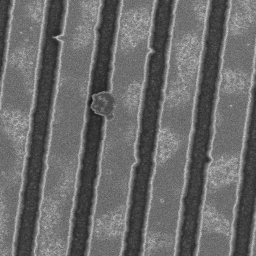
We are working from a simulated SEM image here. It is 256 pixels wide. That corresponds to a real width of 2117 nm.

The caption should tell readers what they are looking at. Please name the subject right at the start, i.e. parallel lines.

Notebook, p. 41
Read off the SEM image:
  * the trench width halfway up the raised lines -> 141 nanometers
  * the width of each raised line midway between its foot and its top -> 304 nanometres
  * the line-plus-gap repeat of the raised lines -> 444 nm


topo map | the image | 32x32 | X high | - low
-XXXXX--XXXXX--XXXXX--XXXX---XXX
-XXXXX--XXXXX--XXXX---XXXX--XXXX
-XXXXX--XXXXX--XXXX---XXXX--XXXX
-XXXXX--XXXX---XXXX--XXXXX--XXXX
-XXXX--XXXXX--XXXXX--XXXXX--XXXX
-XXXX--XXXXX--XXXXX--XXXXX--XXXX
-XXXX--XXXXX--XXXXX--XXXX---XXXX
-XXXX--XXXXX--XXXXX--XXXX---XXXX
XXXXX--XXXXX--XXXX---XXXX--XXXXX
XXXXX--XXXX---XXXX---XXXX--XXXXX
XXXXX--XXXX---XXXX--XXXXX--XXXXX
XXXXX--XXXX--XXXXX--XXXXX--XXXX-
XXXX---XXXXXXXXXXX--XXXXX--XXXX-
XXXX--XXXXXXXXXXXX--XXXX---XXXX-
XXXX--XXXXX--XXXXX--XXXX---XXXX-
XXXX--XXXXX--XXXXX--XXXX---XXXX-
XXXX--XXXXX--XXXXX--XXXX---XXXX-
XXXX--XXXXX--XXXX--XXXXX--XXXXX-
XXXX--XXXX---XXXX--XXXXX--XXXXX-
XXXX--XXXX--XXXXX--XXXXX--XXXX--
XXX---XXXX--XXXXX--XXXXX--XXXX--
XXX--XXXXX--XXXXX--XXXXX--XXXX--
XXX--XXXXX--XXXXX--XXXX---XXXX--
XXX--XXXXX--XXXX---XXXX--XXXXX--
XXX--XXXXX--XXXX---XXXX--XXXXX--
XXX--XXXX---XXXX--XXXXX--XXXXX--
XXX--XXXX--XXXXX--XXXXX--XXXXX--
XX---XXXX--XXXXX--XXXXX--XXXX---
XX--XXXXX--XXXXX--XXXXX--XXXX---
XX--XXXXX--XXXXX--XXXX---XXXX--X
XX--XXXXX--XXXXX--XXXX---XXXX--X
XX--XXXXX--XXXX---XXXX--XXXXX--X